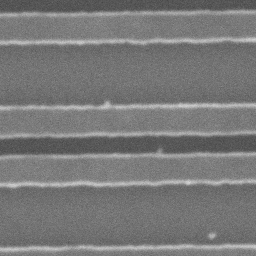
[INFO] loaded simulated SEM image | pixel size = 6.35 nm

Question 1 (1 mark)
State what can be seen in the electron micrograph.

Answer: lines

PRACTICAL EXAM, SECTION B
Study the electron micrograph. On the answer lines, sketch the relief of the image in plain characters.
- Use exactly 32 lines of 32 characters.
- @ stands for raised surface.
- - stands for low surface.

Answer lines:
--------------------------------
-------------------------@--@@@@
@@@@@@@@@@@@@@@@@@@@@@@@@@@@@@@@
@@@@@@@@@@@@@@@@@@@@@@@@@@@@@@@@
@@@@@@@@@@@@@@@@@@@@@@@@@@@@@@@@
--------------------------------
--------------------------------
--------------------------------
--------------------------------
--------------------------------
--------------------------------
--------------------------------
--------------------------------
@@@@@@@@@@@@@@@@@@@@@@@@@@@@@@@@
@@@@@@@@@@@@@@@@@@@@@@@@@@@@@@@@
@@@@@@@@@@@@@@@@@@@@@@@@@@@@@@@@
@@@@@@@@@@@@@@@@@@@@@@@@@@@@@@@@
--------------------------------
--------------------------------
-@@@@@@@@@@@@@@@@@@@@@@@@@@@@@@@
@@@@@@@@@@@@@@@@@@@@@@@@@@@@@@@@
@@@@@@@@@@@@@@@@@@@@@@@@@@@@@@@@
@@@@@@@@@@@@@@@@@@@@@@@@@@@@@@@@
--------------------------------
--------------------------------
--------------------------------
--------------------------------
--------------------------------
--------------------------------
--------------------------------
--------------------------------
@@@@@@@@@@@@@@@@@@@@@@@@@@@@@@@@